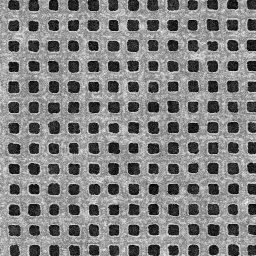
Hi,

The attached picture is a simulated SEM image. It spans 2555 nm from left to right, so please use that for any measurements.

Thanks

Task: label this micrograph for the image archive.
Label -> a regular array of holes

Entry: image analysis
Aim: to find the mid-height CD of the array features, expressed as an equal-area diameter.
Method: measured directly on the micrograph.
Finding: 125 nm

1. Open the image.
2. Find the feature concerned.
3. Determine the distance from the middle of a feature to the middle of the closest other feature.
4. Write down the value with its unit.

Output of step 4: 196 nm